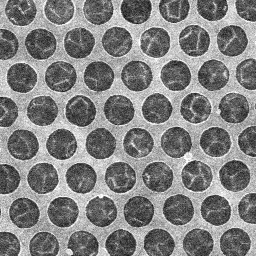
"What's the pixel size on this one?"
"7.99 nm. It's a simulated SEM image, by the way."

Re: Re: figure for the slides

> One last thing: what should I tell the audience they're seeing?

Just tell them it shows a regular array of holes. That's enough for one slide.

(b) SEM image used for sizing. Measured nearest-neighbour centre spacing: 38 pixels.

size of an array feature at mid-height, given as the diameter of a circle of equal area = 0.253 um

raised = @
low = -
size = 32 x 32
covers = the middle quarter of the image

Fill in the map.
--@@@@-----@@@@------@@@@------@
---@@-------@@--------@@--------
---@@--------@--------@@--------
---@@--------@--------@@--------
---@@-------@@@-------@@@-------
---@@-------@@@------@@@@------@
-@@@@@@----@@@@@@---@@@@@@---@@@
@@@@@@@@@@@@@@@@@@@@@@---@@@@@@-
@@----@@@@@-----@@@@@-----@@@@--
@------@@@-------@@@-------@@---
--------@@--------@--------@@---
--------@@--------@--------@@---
--------@@--------@@-------@@---
--------@@-------@@@------@@@@--
@------@@@@-----@@@@@-----@@@@@-
@@@---@@@@@@@-@@@@@@@@@@@@@@@@@@
-@@@@@@----@@@@@-----@@@@@----@@
--@@@@------@@@-------@@@------@
---@@--------@@-------@@--------
---@@--------@@--------@--------
---@@--------@@--------@--------
---@@--------@@-------@@@-------
---@@@------@@@@-----@@@@-----@@
--@@@@@----@@@@@@---@@@@@@@--@@@
@@@@-@@@@@@@@--@@@@@@@---@@@@@@-
@@-----@@@@------@@@@-----@@@@--
@-------@@--------@@-------@@---
--------@@--------@@--------@---
--------@@--------@@--------@---
--------@@--------@@-------@@@--
@-------@@@-------@@-------@@@--
@@-----@@@@@-----@@@@-----@@@@@-